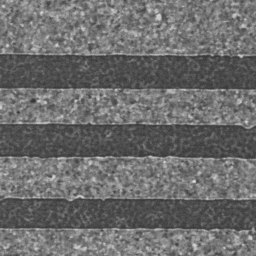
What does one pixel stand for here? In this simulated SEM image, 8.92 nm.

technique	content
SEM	one or a few lines or trenches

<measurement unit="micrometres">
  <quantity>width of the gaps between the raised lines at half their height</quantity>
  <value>0.3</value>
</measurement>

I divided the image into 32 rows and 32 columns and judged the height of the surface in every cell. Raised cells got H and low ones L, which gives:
HHHHHHHHHHHHHHHHHHHHHHHHHHHHHHHH
HHHHHHHHHHHHHHHHHHHHHHHHHHHHHHHH
HHHHHHHHHHHHHHHHHHHHHHHHHHHHHHHH
HHHHHHHHHHHHHHHHHHHHHHHHHHHHHHHH
HHHHHHHHHHHHHHHHHHHHHHHHHHHHHHHH
HHHHHHHHHHHHHHHHHHHHHHHHHHHHHHHH
HHHHHHHHHHHHHHHHHHHHHHHHHHHHHHHH
LLLLLLLLLLLLLLLLLLLLLLLLLLLLLLLL
LLLLLLLLLLLLLLLLLLLLLLLLLLLLLLLL
LLLLLLLLLLLLLLLLLLLLLLLLLLLLLLLL
LLLLLLLLLLLLLLLLLLLLLLLLLLLLLLLL
HHHHHHHHHHHHHHHHHHHHHHHHHHHHHHHH
HHHHHHHHHHHHHHHHHHHHHHHHHHHHHHHH
HHHHHHHHHHHHHHHHHHHHHHHHHHHHHHHH
HHHHHHHHHHHHHHHHHHHHHHHHHHHHHHHH
LLLLLLLLLLLLLLLLLLLLLLLLHLLHHLHH
LLLLLLLLLLLLLLLLLLLLLLLLLLLLLLLL
LLLLLLLLLLLLLLLLLLLLLLLLLLLLLLLL
LLLLLLLLLLLLLLLLLLLLLLLLLLLLLLLL
LLLLLLLLLLLLLLLLLLLLLLLLLLLLLLLL
HHHHHHHHHHHHHHHHHHHHHHHHHHHHHHHH
HHHHHHHHHHHHHHHHHHHHHHHHHHHHHHHH
HHHHHHHHHHHHHHHHHHHHHHHHHHHHHHHH
HHHHHHHHHHHHHHHHHHHHHHHHHHHHHHHH
HHHHHHHHHHHHHHHHHHHHHHHHHHHHHHHH
LLLLLLLLLLLLLLLLLLLLLLLLLLLLLLLL
LLLLLLLLLLLLLLLLLLLLLLLLLLLLLLLL
LLLLLLLLLLLLLLLLLLLLLLLLLLLLLLLL
LLLLLLLLLLLLLLLLLLLLLLLLLLLLLLLL
HHHHHHHHHHHHHHHHHHHHHHHHHHHHHHHH
HHHHHHHHHHHHHHHHHHHHHHHHHHHHHHHH
HHHHHHHHHHHHHHHHHHHHHHHHHHHHHHHH